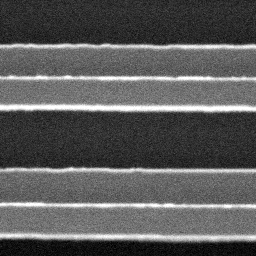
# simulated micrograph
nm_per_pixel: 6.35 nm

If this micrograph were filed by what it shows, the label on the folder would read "lines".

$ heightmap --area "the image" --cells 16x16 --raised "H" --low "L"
LLLLLLLLLLLLLLLL
LLLLLLLLLLLLLLLL
LLLLLLLLLLLLLLLL
HHHHHHHHHHHHHHHH
HHHHHHHHHHHHHHHH
HHHHHHHHHHHHHHHH
HHHHHHHHHHHHHHHH
LLLLLLLLLLLLLLLL
LLLLLLLLLLLLLLLL
LLLLLLLLLLLLLLLL
LLLLLLLLLLLLLLLL
HHHHHHHHHHHHHHHH
HHHHHHHHHHHHHHHH
HHHHHHHHHHHHHHHH
HHHHHHHHHHHHHHHH
LLLLLLLLLLLLLLLL